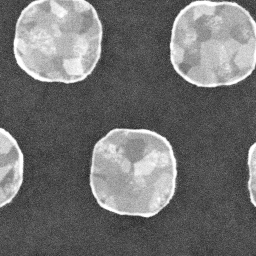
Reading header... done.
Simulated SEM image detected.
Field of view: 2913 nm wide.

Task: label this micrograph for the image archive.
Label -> raised bodies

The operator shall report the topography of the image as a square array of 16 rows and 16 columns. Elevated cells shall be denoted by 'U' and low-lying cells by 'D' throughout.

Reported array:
DDUUUUDDDDDDUUUD
DUUUUUDDDDDUUUUU
DUUUUUDDDDDUUUUU
DUUUUUDDDDDUUUUU
DDUUUUDDDDDUUUUU
DDDDDDDDDDDDDDDD
DDDDDDDDDDDDDDDD
DDDDDDDDDDDDDDDD
UDDDDDDUUUDDDDDD
UDDDDDUUUUUDDDDD
UDDDDDUUUUUDDDDD
UDDDDDUUUUUDDDDD
UDDDDDUUUUUDDDDD
DDDDDDDDDDDDDDDD
DDDDDDDDDDDDDDDD
DDDDDDDDDDDDDDDD